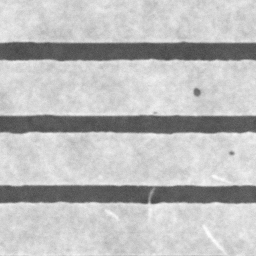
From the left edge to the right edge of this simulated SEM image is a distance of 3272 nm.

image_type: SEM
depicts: lines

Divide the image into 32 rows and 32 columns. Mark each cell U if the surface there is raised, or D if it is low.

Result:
UUUUUUUUUUUUUUUUUUUUUUUUUUUUUUUU
UUUUUUUUUUUUUUUUUUUUUUUUUUUUUUUU
UUUUUUUUUUUUUUUUUUUUUUUUUUUUUUUU
UUUUUUUUUUUUUUUUUUUUUUUUUUUUUUUU
UUUUUUUUUUUUUUUUUUUUUUUUUUUUUUUU
DDDDDDDDDDDDDDDDDDDDDDDDDDDDDDDD
DDDDDDDDDDDDDDDDDDDDDDDDDDDDDDDD
DDDDDDDDDDDDDDDDDDUDDDDDDDDDDDDD
UUUUUUUUUUUUUUUUUUUUUUUUUUUUUUUU
UUUUUUUUUUUUUUUUUUUUUUUUUUUUUUUU
UUUUUUUUUUUUUUUUUUUUUUUUUUUUUUUU
UUUUUUUUUUUUUUUUUUUUUUUUUUUUUUUU
UUUUUUUUUUUUUUUUUUUUUUUUUUUUUUUU
UUUUUUUUUUUUUUUUUUUUUUUUUUUUUUUU
DDDDDDDDDDDDDDDDDDDDDDDDDDDDDDDD
DDDDDDDDDDDDDDDDDDDDDDDDDDDDDDDD
DDDDDDDDDDDDDDDDDDDDDDDDDDDDDDDD
UUUUUUUUUUUUUUUUUUUUUUUUUUUUUUUU
UUUUUUUUUUUUUUUUUUUUUUUUUUUUUUUU
UUUUUUUUUUUUUUUUUUUUUUUUUUUUUUUU
UUUUUUUUUUUUUUUUUUUUUUUUUUUUUUUU
UUUUUUUUUUUUUUUUUUUUUUUUUUUUUUUU
UUUUUUUUUUUUUUUUUUUUUUUUUUUUUUUU
DDDDDDDDDDDDDDDDDDDDDDDDDDDDDDDD
DDDDDDDDDDDDDDDDDDDDDDDDDDDDDDDD
UUUUUUUUUUUUUUUUUUUUUUUUUUUUUDUU
UUUUUUUUUUUUUUUUUUUUUUUUUUUUUUUU
UUUUUUUUUUUUUUUUUUUUUUUUUUUUUUUU
UUUUUUUUUUUUUUUUUUUUUUUUUUUUUUUU
UUUUUUUUUUUUUUUUUUUUUUUUUUUUUUUU
UUUUUUUUUUUUUUUUUUUUUUUUUUUUUUUU
UUUUUUUUUUUUUUUUUUUUUUUUUUUUUUUU